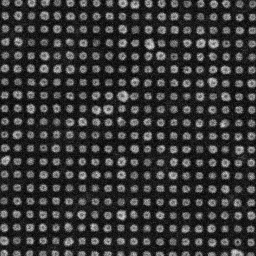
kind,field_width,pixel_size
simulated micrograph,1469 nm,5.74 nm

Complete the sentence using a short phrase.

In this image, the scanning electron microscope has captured a regular array of raised bodies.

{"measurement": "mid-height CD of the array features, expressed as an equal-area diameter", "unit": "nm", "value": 41.5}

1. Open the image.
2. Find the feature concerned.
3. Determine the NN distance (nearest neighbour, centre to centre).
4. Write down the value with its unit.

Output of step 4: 73.1 nanometres